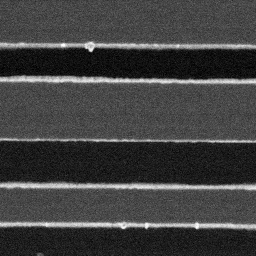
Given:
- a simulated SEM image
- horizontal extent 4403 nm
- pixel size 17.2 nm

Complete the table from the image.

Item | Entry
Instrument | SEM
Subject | lines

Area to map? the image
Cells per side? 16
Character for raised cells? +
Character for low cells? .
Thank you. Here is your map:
++++++++++++++++
++++++++++++++++
++++++++++++++++
................
................
++++++++++++++++
++++++++++++++++
++++++++++++++++
++++++++++++++++
................
................
................
++++++++++++++++
++++++++++++++++
................
................